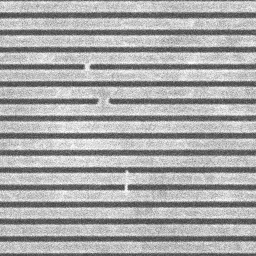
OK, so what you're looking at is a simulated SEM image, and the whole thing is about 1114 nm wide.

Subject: parallel lines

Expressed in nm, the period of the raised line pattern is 74.7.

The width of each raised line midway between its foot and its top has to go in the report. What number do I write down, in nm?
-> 47.9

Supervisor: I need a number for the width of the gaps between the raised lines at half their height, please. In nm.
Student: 27.7